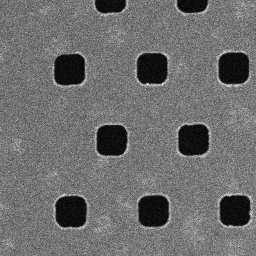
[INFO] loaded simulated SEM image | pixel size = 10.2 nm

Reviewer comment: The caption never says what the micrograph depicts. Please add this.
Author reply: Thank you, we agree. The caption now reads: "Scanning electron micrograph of a regular array of holes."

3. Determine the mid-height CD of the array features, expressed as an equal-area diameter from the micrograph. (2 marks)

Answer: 338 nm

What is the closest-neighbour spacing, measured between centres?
831 nanometers